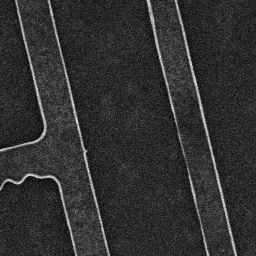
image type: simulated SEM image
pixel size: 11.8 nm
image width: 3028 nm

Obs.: one or a few lines or trenches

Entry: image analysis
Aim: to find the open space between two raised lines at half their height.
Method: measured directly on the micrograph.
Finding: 1.14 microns